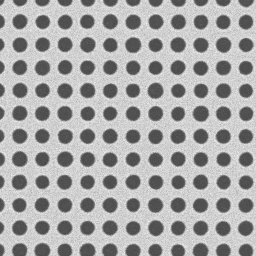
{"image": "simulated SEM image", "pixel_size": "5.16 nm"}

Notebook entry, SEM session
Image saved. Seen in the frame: a regular array of holes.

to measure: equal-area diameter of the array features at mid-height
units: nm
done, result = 75.4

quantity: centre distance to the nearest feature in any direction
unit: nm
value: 116